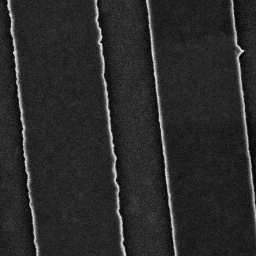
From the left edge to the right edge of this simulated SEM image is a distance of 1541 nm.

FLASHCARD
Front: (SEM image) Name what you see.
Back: one or a few lines or trenches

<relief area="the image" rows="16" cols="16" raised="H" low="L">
LHHHHHLLLHHHHHHL
LHHHHHLLLHHHHHHL
LHHHHHLLLHHHHHHL
LHHHHHLLLLHHHHHL
LHHHHHHLLLHHHHHL
LHHHHHHLLLHHHHHL
LHHHHHHLLLHHHHHL
LHHHHHHLLLHHHHHL
LHHHHHHLLLHHHHHL
LLHHHHHLLLHHHHHH
LLHHHHHLLLHHHHHH
LLHHHHHLLLHHHHHH
LLHHHHHLLLLHHHHH
LLHHHHHLLLLHHHHH
LLHHHHHHLLLHHHHH
LLHHHHHHLLLHHHHH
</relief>